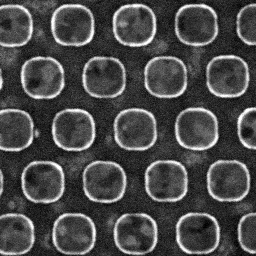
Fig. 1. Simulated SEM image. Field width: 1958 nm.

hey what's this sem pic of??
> a regular array of raised bodies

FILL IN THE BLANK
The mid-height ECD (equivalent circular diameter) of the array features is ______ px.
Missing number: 42.5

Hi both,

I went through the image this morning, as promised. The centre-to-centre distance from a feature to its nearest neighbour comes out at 462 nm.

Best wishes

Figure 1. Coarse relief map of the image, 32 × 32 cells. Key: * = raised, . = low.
................................
***....****....****...*****...**
****...*****..*****...*****...**
****...*****..*****...*****...**
****...****...*****...*****...**
***.....**......**.....***......
................................
....***....****....***.....***..
...*****...****...*****...*****.
...*****...*****..*****...*****.
...*****...*****..*****...*****.
...****....****....****....***..
................................
................................
****...****....****...*****...**
****...*****..*****...*****...**
****...*****..*****...*****...**
****...*****...****...*****...**
***.....***.....**.....***......
................................
....***....****....***.....***..
...*****...****...*****...*****.
...*****...****...*****...*****.
...*****...****...*****...*****.
...*****...****....****....****.
................................
................................
****...****....****....****...**
****...*****...****...*****...**
****...*****...****...*****...**
****...*****...****...*****...**
***.....***.....***....***.....*